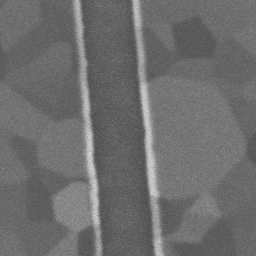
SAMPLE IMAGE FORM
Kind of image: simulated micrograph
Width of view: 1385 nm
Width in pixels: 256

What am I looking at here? one or a few lines or trenches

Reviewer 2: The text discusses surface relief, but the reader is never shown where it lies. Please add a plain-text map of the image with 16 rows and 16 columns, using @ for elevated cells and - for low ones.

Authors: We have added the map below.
@@@@@----@@@@@@@
@@@@@----@@@@@@@
@@@@@----@@@@@@@
@@@@@----@@@@@@@
@@@@@----@@@@@@@
@@@@@----@@@@@@@
@@@@@----@@@@@@@
@@@@@----@@@@@@@
@@@@@@---@@@@@@@
@@@@@@---@@@@@@@
@@@@@@---@@@@@@@
@@@@@@---@@@@@@@
@@@@@@----@@@@@@
@@@@@@----@@@@@@
@@@@@@----@@@@@@
@@@@@@----@@@@@@